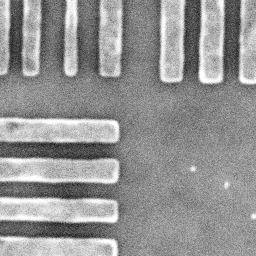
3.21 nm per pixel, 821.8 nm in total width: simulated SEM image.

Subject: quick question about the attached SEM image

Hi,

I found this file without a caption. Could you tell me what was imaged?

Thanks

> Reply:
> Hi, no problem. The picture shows groups of lines, slits or small figures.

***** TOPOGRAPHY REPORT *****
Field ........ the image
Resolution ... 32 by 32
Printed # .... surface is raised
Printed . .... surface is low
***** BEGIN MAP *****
#..##........##.....###..###..##
#..##........##.....###..###..##
#..##...#....##.....###..###..##
#..##...#....##.....###..###..##
#..##...#...###.....###..###..##
#..##...#...###.....###..###..##
#..##...#....##.....###..###..##
#..##...##...##.....###..###..##
#..##...##...##.....###..###..##
....................###..###..##
................................
................................
................................
................................
................................
##############..................
###############.................
##############..................
................................
................................
###############.................
###############.................
......########..................
................................
................................
##############..................
###############.................
......####......................
................................
................................
##############..................
##############..................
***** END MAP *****